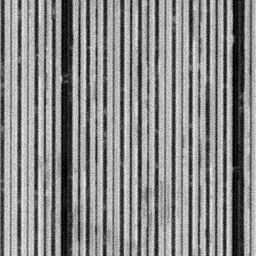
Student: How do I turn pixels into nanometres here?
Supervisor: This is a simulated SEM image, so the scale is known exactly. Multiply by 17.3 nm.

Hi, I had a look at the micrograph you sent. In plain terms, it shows parallel lines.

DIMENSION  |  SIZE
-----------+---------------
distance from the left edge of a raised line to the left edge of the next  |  148 nanometres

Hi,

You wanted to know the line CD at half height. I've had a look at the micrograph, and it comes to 88.5 nm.